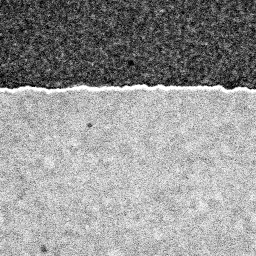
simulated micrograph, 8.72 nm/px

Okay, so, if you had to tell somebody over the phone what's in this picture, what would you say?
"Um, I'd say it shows one or a few lines or trenches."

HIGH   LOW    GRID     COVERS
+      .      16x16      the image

................
................
................
................
................
.+...+++++++++..
++++++++++++++++
++++++++++++++++
++++++++++++++++
++++++++++++++++
++++++++++++++++
++++++++++++++++
++++++++++++++++
++++++++++++++++
++++++++++++++++
++++++++++++++++